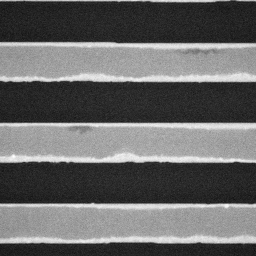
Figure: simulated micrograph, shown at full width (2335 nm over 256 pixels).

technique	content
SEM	lines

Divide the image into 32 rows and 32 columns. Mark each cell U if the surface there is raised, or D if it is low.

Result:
DDDDDDDDDDDDDDDDDDDDDDDDDDDDDDDD
DDDDDDDDDDDDDDDDDDDDDDDDDDDDDDDD
DDDDDDDDDDDDDDDDDDDDDDDDDDDDDDDD
DDDDDDDDDDDDDDDDDDDDDDDDDDDDDDDD
DDDDDDDDDDDDDDDDDDDDDDDDDDDDDDDD
UUUUUUUUUUUUUUUUUUUUUUDUUDUUUUUU
UUUUUUUUUUUUUUUUUUUUUUUUUUUUUUUU
UUUUUUUUUUUUUUUUUUUUUUUUUUUUUUUU
UUUUUUUUUUUUUUUUUUUUUUUUUUUUUUUU
UUUUUUUUUUUUUUUUUUUUUUUUUUUUUUUU
DDDDDDDDDDDDDDDDDDDDDDDDDDDDDDDD
DDDDDDDDDDDDDDDDDDDDDDDDDDDDDDDD
DDDDDDDDDDDDDDDDDDDDDDDDDDDDDDDD
DDDDDDDDDDDDDDDDDDDDDDDDDDDDDDDD
DDDDDDDDDDDDDDDDDDDDDDDDDDDDDDDD
UUUUUUUUUUUUUUUUUUUUDDDDDDDDDDDD
UUUUUUUUUUUUUUUUUUUUUUUUUUUUUUUU
UUUUUUUUUUUUUUUUUUUUUUUUUUUUUUUU
UUUUUUUUUUUUUUUUUUUUUUUUUUUUUUUU
UUUUUUUUUUUUUUUUUUUUUUUUUUUUUUUU
DDDDDDDDDDDDDDDDDDDDDDDDDDDDDDDD
DDDDDDDDDDDDDDDDDDDDDDDDDDDDDDDD
DDDDDDDDDDDDDDDDDDDDDDDDDDDDDDDD
DDDDDDDDDDDDDDDDDDDDDDDDDDDDDDDD
DDDDDDDDDDDDDDDDDDDDDDDDDDDDDDDD
DDDDDDDDDDDDDDDDDDDDDDDDDDDDDDDD
UUUUUUUUUUUUUUUUUUUUUUUUUUUUUUUU
UUUUUUUUUUUUUUUUUUUUUUUUUUUUUUUU
UUUUUUUUUUUUUUUUUUUUUUUUUUUUUUUU
UUUUUUUUUUUUUUUUUUUUUUUUUUUUUUUU
DDDDDDDDDDDDDDDDDDDDDDDDDDDDDDDD
DDDDDDDDDDDDDDDDDDDDDDDDDDDDDDDD